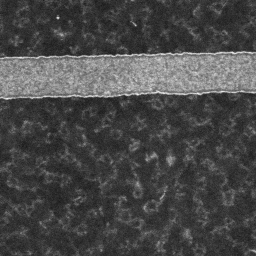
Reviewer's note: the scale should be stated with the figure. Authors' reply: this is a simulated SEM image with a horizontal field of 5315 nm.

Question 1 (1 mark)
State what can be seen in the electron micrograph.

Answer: one or a few lines or trenches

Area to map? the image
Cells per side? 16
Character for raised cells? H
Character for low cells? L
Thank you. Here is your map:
HHHHHHHHHHHHHHHH
HHHHHHHHHHHHHHHH
HHHHHHHHHHHHHHHH
HHHHHHLLLLLLLLLL
LLLLLLLLLLLLLLLL
LLLLLLLLLLLLLLLL
HHHHHHHHHHHHHHHH
HHHHHHHHHHHHHHHH
HHHHHHHHHHHHHHHH
HHHHHHHHHHHHHHHH
HHHHHHHHHHHHHHHH
HHHHHHHHHHHHHHHH
HHHHHHHHHHHHHHHH
HHHHHHHHHHHHHHHH
HHHHHHHHHHHHHHHH
HHHHHHHHHHHHHHHH